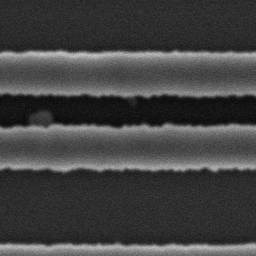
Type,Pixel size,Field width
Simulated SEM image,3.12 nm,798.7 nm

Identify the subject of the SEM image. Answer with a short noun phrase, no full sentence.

lines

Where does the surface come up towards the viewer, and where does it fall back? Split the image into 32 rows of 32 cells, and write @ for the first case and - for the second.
--------------------------------
--------------------------------
--------------------------------
--------------------------------
--------------------------------
--------------------------------
-------@------------------------
@@@@@@@@@@@@@@@@@@@@@@@@@@@@@@@@
@@@@@@@@@@@@@@@@@@@@@@@@@@@@@@@@
@@@@@@@@@@@@@@@@@@@@@@@@@@@@@@@@
@@@@@@@@@@@@@@@@@@@@@@@@@@@@@@@@
@@@@@@@@@@@@@@@@@@@@@@@@@@@@@@@@
--------------------------------
--------------------------------
--------------------------------
--------------------------------
@@@@@@@@@@@@@@@@@@@@@@@@@@@@@@@@
@@@@@@@@@@@@@@@@@@@@@@@@@@@@@@@@
@@@@@@@@@@@@@@@@@@@@@@@@@@@@@@@@
@@@@@@@@@@@@@@@@@@@@@@@@@@@@@@@@
@@@@@@@@@@@@@@@@@@@@@@@@@@@@@@@@
--------------------------------
--------------------------------
--------------------------------
--------------------------------
--------------------------------
--------------------------------
--------------------------------
--------------------------------
--------------------------------
--------------------------------
@@@@@@@@@@@@@@@@@@@@@@@@@@@@@@@@